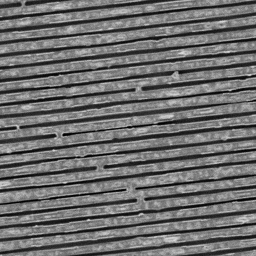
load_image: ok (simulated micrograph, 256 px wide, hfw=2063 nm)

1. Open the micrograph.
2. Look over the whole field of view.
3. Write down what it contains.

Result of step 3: parallel lines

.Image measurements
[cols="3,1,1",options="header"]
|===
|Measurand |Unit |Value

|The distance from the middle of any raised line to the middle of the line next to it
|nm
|98.5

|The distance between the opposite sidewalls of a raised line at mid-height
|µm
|0.0681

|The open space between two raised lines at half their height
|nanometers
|28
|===